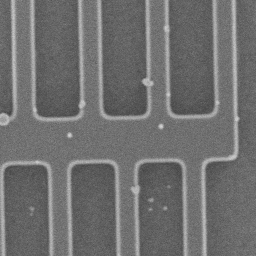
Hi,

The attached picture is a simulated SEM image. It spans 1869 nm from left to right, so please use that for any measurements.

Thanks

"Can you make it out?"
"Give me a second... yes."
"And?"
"groups of lines, slits or small figures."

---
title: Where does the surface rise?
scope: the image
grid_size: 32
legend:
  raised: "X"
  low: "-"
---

--XX------XX------XXX------XX---
--XX------XX------XXX------XX---
--XX------XX------XXX------XX---
--XX------XX------XXX------XX---
--XX------XX------XXX------XX---
--XX------XXX-----XXX------XX---
--XX------XXX------XX------XX---
--XX------XXX------XX------XX---
--XX------XXX------XX------XX---
--XX------XXX-----XXX------XX---
--XX------XXX-----XXX------XX---
--XX------XXX------XX------XX---
--XX------XXX------XX------XX---
--XX------XXX------XX------XX---
XXXXX-----XXX-----XXXX---XXXXX--
XXXXXXXXXXXXXXXXXXXXXXXXXXXXXX--
XXXXXXXXXXXXXXXXXXXXXXXXXXXXXX--
XXXXXXXXXXXXXXXXXXXXXXXXXXXXXX--
XXXXXXXXXXXXXXXXXXXXXXXXXXXXXX--
XXXXXXXXXXXXXXXXXXXXXXXXXXXXX---
XX---XXXX-----XXXX-----XXX------
------XXX------XX------XX-------
------XXX------XX------XX-------
------XXX------XX------XX-------
------XXX------XX------XX-------
------XXX------XX------XX-------
------XXX------XX------XXX------
------XXX------XX------XXX------
------XXX------XX------XXX------
------XXX------XX------XXX------
------XXX------XX------XXX------
X-----XXX------XX------XXX------